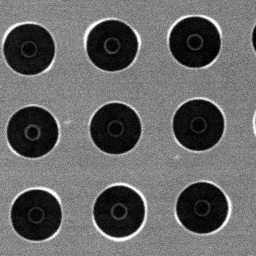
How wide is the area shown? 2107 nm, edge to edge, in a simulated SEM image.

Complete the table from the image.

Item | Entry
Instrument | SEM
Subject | an array of small figures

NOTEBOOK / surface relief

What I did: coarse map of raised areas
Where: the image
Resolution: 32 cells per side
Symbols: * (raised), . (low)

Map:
********************************
********************************
*************..*******....******
**....*****.....*****......*****
*.....*****......****...*...***.
...*...****..**..****...*...****
...*...****......****......*****
*......****......*****.....*****
*.....******....********.*******
********************************
********************************
********************************
************************..******
***..*******....******.....*****
*......*****.....*****......****
*......****...*...****..**..****
*..**..****...*...****......****
*......****......*****.....*****
*......*****.....******...******
***..***************************
********************************
********************************
********************************
*************....******....*****
**.....*****......****......****
**......****......****...*...***
*...*...****..**..****...*...***
*...*...****......****......****
**.....*****......*****....*****
***....******...****************
********************************
********************************